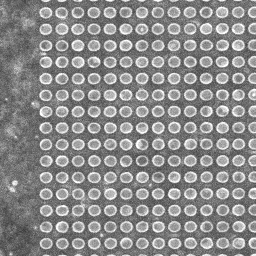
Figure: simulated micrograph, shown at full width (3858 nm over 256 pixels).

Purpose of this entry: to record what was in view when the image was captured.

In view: a regular array of raised bodies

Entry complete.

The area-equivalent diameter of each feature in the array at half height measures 0.167 µm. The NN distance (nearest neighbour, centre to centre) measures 240 nm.